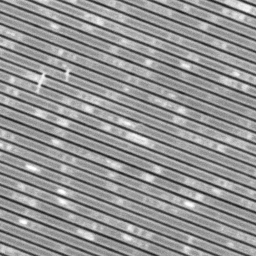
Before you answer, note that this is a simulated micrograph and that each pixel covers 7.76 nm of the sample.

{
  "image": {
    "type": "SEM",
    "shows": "parallel lines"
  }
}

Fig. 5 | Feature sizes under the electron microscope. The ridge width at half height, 61.6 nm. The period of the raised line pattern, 83.4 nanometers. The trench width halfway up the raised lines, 22.7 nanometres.